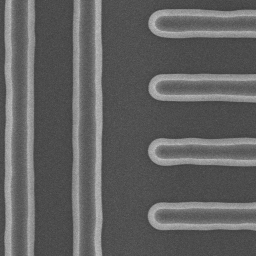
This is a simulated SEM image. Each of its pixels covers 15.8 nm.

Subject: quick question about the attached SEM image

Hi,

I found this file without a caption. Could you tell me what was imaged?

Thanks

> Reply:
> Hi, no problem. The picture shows groups of lines, slits or small figures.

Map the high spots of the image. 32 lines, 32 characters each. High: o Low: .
.ooo......oo....................
.ooo......oo....................
.ooo......oo.......ooooooooooooo
.ooo......oo.......ooooooooooooo
.ooo......oo....................
.ooo......oo....................
.ooo......oo....................
.ooo......oo....................
.ooo......oo....................
.ooo......oo....................
.ooo......oo.......ooooooooooooo
.ooo......oo.......ooooooooooooo
.ooo.....ooo....................
.ooo.....ooo....................
.ooo......oo....................
.ooo.....ooo....................
.ooo.....ooo....................
.ooo.....ooo....................
.ooo.....ooo.......ooooooooooooo
.ooo......oo.......ooooooooooooo
.ooo.....ooo....................
.ooo.....ooo....................
.ooo.....ooo....................
.ooo.....ooo....................
.ooo.....ooo....................
.ooo.....ooo....................
.ooo......oo.......ooooooooooooo
.ooo......oo.......ooooooooooooo
.ooo......oo....................
.ooo......oo....................
.ooo......oo....................
.ooo......oo....................